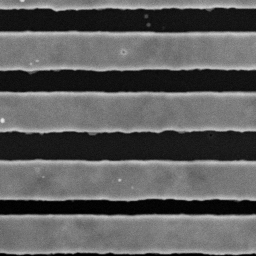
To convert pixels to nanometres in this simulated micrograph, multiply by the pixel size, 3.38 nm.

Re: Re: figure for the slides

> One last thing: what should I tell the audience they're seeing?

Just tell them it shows lines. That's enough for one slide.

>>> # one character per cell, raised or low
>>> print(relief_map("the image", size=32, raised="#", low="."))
################################
................................
................................
................................
################################
################################
################################
################################
################################
................................
................................
##.##########....##.....########
################################
################################
################################
################################
...###.......#.##..#............
................................
................................
................................
################################
################################
################################
################################
################################
................................
................................
################################
################################
################################
################################
################################